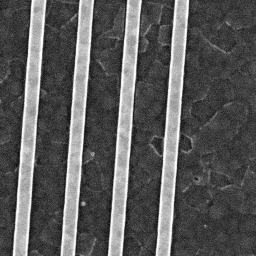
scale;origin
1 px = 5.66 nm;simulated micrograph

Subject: parallel lines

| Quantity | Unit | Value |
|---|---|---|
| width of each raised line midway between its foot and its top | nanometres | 71.3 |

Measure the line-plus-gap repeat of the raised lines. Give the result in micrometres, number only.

0.269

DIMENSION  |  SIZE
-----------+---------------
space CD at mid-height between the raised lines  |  197 nanometres